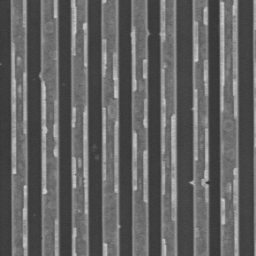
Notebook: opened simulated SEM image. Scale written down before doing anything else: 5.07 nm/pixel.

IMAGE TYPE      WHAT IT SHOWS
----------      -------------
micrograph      parallel lines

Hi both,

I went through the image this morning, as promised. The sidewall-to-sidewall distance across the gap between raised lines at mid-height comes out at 0.0735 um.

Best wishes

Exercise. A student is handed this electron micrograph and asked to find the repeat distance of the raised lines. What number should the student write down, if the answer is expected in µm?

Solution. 0.152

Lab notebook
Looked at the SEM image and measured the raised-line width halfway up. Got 78.6 nm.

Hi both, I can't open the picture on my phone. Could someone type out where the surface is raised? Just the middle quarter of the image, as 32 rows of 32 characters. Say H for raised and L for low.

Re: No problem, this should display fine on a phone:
LLHHHHLLLHHHHLLLLHHHHLLLHHHHLLLL
LLHHHHLLLHHHHLLLLHHHHLLLHHHHLLLL
LLHHHHLLLLHHHLLLLHHHHLLLHHHHLLLL
LLHHHHLLLLHHHLLLLHHHHLLLHHHHLLLL
LLHHHHLLLLHHHLLLLHHHHLLLHHHHLLLL
LLHHHHLLLLHHHLLLLHHHHLLLHHHHLLLL
LLHHHHLLLLHHHLLLLHHHHLLLHHHHLLLL
LLHHHHLLLLHHHLLLLHHHHLLLHHHHLLLL
LLHHHHLLLLHHHLLLLHHHHLLLHHHHLLLL
LLHHHHLLLLHHHLLLLHHHHLLLHHHHLLLL
LLHHHHLLLLHHHLLLLHHHHLLLHHHHLLLL
LLHHHHLLLLHHHLLLLHHHHLLLHHHHLLLL
LLHHHHLLLLHHHLLLLHHHHLLLHHHHLLLL
LLHHHHLLLLHHHLLLLHHHHLLLHHHHLLLL
LLHHHHLLLLHHHLLLLHHHHLLLHHHHLLLL
LLHHHHLLLLHHHLLLLHHHHLLLHHHHLLLL
LLHHHHLLLLHHHLLLLHHHHLLLHHHHLLLL
LLHHHHLLLLHHHLLLLHHHHLLLHHHHLLLL
LLHHHHLLLLHHHLLLLHHHHLLLHHHHLLLL
LLHHHHLLLLHHHLLLLHHHHLLLHHHHLLLL
LLHHHHLLLLHHHLLLLHHHHLLLHHHHLLLL
LLHHHHLLLLHHHLLLLHHHHLLLHHHHLLLL
LLHHHHLLLLHHHLLLLHHHHLLLHHHHLLLL
LLHHHHLLLLHHHLLLLHHHHLLLHHHHLLLL
LLHHHHLLLLHHHLLLLHHHHLLLHHHHLLLL
LLHHHHLLLLHHHLLLLHHHHLLLHHHHLLLL
LLHHHHLLLLHHHLLLLHHHHLLLLHHHLLLL
LLHHHHLLLLHHHLLLLHHHHLLLLHHHLLLL
LLHHHHLLLLHHHLLLLHHHHLLLLHHHLLLL
LLHHHHLLLLHHHLLLLHHHHLLLHHHHLLLL
LLHHHHLLLLHHHLLLLHHHHLLLHHHHLLLL
LLHHHHLLLLHHHLLLLHHHHLLLHHHHLLLL